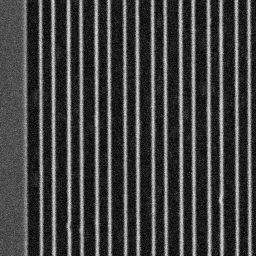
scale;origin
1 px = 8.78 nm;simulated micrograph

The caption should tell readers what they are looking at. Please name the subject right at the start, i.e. parallel lines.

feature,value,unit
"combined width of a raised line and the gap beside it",122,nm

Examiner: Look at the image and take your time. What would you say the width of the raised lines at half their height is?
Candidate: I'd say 25.2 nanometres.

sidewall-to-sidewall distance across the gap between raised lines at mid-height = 93.3 nanometers